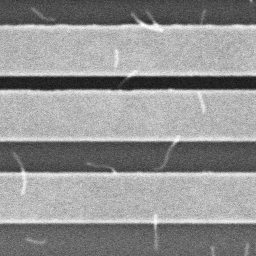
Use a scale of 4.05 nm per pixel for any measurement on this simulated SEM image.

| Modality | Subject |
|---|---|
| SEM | lines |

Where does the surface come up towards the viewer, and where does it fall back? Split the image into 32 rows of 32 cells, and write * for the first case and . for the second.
................................
................................
................................
********************************
********************************
********************************
********************************
********************************
********************************
...............**...............
................................
********************************
********************************
********************************
********************************
********************************
********************************
********************************
................................
................................
................................
................................
********************************
********************************
********************************
********************************
********************************
********************************
................................
................................
................................
................................